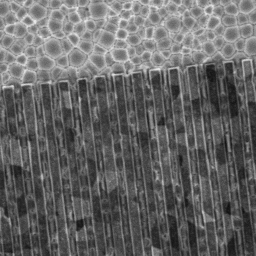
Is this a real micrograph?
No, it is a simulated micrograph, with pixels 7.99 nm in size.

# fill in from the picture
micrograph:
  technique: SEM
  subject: parallel lines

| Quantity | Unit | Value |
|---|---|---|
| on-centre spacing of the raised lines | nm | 147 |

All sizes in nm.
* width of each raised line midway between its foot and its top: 81.3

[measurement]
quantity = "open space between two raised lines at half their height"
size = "67.4 nm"